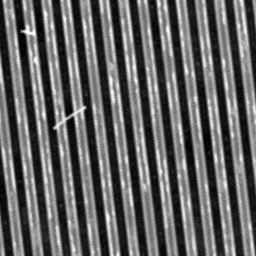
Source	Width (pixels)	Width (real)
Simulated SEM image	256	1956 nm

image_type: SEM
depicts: parallel lines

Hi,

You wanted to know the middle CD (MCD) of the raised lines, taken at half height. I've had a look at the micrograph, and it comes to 76.9 nm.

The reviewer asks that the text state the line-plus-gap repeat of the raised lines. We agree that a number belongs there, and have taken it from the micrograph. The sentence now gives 146 nm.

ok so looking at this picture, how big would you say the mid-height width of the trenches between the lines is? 70.2 nm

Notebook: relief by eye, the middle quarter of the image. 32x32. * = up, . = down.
.**...**...**...**...**..***..**
.***..**...**...**...**..***..**
.***..***..**...**...**...**..**
.***..***..***..**...**...**..**
..**..***..***..**...**...**..**
..**...**..***..**...**...**...*
..**...**...**..***..**...**...*
..**...**...**..***..**...**...*
..**...**...**...**..***..**...*
..***..**...**...**...**..***..*
..***..***..**...**...**..***..*
..***..***..***..**...**...**..*
..***..***..***..**...**...**..*
*..**...**..***..**...**...**...
...**...**..***..**...**...**...
...**...**...**..***..**...**...
*..**...**...**...**..***..**...
*..***..**...**...**...**..***..
*..***..**...**...**...**...**..
*..***..***..**...**...**...**..
*..***..***..***..**...**...**..
*...**..***..***..**...**...**..
*...**...**..***..**...**...**..
*...**...**...**..***..**...**..
*...**...**...**...**..***..**..
**..**...**...**...**..***..**..
**..***..**...**...**...**..***.
**..***..***..**...**...**..***.
**..***..***..***..**...**..***.
**...**..***..***..**...**...**.
**...**...**..***..***..**...**.
**...**...**...**..***..**...**.